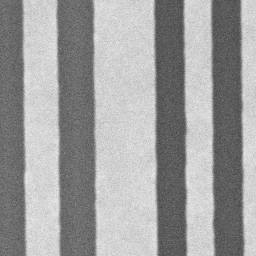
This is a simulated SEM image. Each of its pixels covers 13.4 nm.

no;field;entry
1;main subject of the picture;groups of lines, slits or small figures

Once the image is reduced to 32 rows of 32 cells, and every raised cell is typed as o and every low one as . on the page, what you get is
...oooo.....ooooooo....ooo....oo
...oooo.....ooooooo....ooo....oo
...oooo.....ooooooo....ooo....oo
...oooo.....ooooooo....ooo....oo
...oooo.....ooooooo....ooo....oo
...oooo.....ooooooo....ooo....oo
...oooo.....ooooooo....ooo....oo
...oooo.....ooooooo....ooo....oo
...oooo.....ooooooo....ooo....oo
...oooo.....ooooooo....ooo....oo
...oooo.....ooooooo....ooo....oo
...oooo.....ooooooo....ooo....oo
...oooo.....ooooooo....ooo....oo
...oooo.....ooooooo....ooo....oo
...oooo.....ooooooo....ooo....oo
...oooo.....ooooooo....oooo...oo
...oooo.....ooooooo....oooo...oo
...oooo.....ooooooo....oooo...oo
...oooo.....ooooooo....ooo....oo
...oooo.....ooooooo....oooo...oo
...oooo.....ooooooo....oooo...oo
...oooo.....ooooooo....oooo...oo
...oooo.....ooooooo....oooo...oo
...oooo.....ooooooo....oooo...oo
...oooo.....ooooooo....oooo...oo
...oooo.....oooooooo...oooo...oo
...oooo.....oooooooo...oooo...oo
...oooo.....oooooooo...oooo...oo
...oooo.....oooooooo...oooo....o
...oooo.....oooooooo...oooo....o
...oooo.....oooooooo...oooo....o
...oooo.....oooooooo...oooo....o